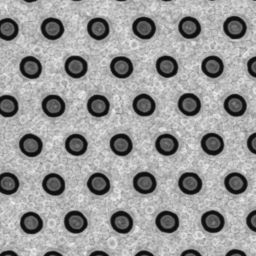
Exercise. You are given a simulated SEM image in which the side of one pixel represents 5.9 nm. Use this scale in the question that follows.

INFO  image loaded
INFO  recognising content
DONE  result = a regular array of ring-shaped grooves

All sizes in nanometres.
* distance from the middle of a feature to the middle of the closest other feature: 262